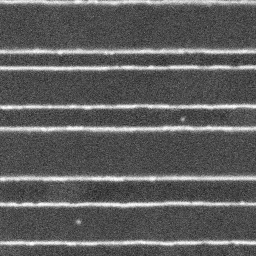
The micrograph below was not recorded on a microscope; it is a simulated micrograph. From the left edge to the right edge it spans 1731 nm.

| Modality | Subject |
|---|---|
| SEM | lines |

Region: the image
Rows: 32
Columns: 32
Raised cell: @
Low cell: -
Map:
@@@@@@@@@@@@@@@@@@@@@@@@@@@@@@@@
@@@@@@@@@@@@@@@@@@@@@@@@@@@@@@@@
@@@@@@@@@@@@@@@@@@@@@@@@@@@@@@@@
@@@@@@@@@@@@@@@@@@@@@@@@@@@@@@@@
@@@@@@@@@@@@@@@@@@@@@@@@@@@@@@@@
@@@@@@@@@@@@@@@@@@@@@@@@@@@@@@@@
@@----@@----@@@-----------------
--------------------------------
@@@@@@@-@@@@@@@@@@@@@@@@@@@@@@@@
@@@@@@@@@@@@@@@@@@@@@@@@@@@@@@@@
@@@@@@@@@@@@@@@@@@@@@@@@@@@@@@@@
@@@@@@@@@@@@@@@@@@@@@@@@@@@@@@@@
@@@@@@@@@@@@@@@@@@@@@@@@@@@@@@@@
--------------------------------
--------------------------------
--------------------------------
@@@@@@@@@@@@@@@@@@@@@@@@@@@@@@@@
@@@@@@@@@@@@@@@@@@@@@@@@@@@@@@@@
@@@@@@@@@@@@@@@@@@@@@@@@@@@@@@@@
@@@@@@@@@@@@@@@@@@@@@@@@@@@@@@@@
@@@@@@@@@@@@@@@@@@@@@@@@@@@@@@@@
@@@@@@@@@@@@@@@@@@@@@@@@@@@@@@@@
--------------------------------
--------------------------------
--------------------------------
@----@-@--@@@@----@@@@@@@@@@@@@@
@@@@@@@@@@@@@@@@@@@@@@@@@@@@@@@@
@@@@@@@@@@@@@@@@@@@@@@@@@@@@@@@@
@@@@@@@@@@@@@@@@@@@@@@@@@@@@@@@@
@@@@@@@@@@@@@@@@@@@@@@@@@@@@@@@@
--------------------@-----------
--------------------------------